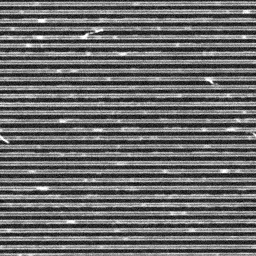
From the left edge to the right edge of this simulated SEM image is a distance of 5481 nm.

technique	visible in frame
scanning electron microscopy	parallel lines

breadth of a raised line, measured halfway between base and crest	72.2	nanometres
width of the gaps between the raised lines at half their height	102	nanometers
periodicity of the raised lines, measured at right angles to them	180	nm